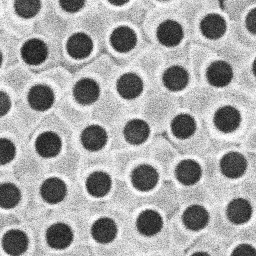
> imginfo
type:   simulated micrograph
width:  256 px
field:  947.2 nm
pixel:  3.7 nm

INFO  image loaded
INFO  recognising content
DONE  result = a regular array of holes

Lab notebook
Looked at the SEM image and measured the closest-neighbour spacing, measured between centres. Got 164 nanometers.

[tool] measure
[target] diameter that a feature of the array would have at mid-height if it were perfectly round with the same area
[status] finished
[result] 104 nm